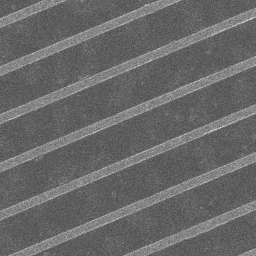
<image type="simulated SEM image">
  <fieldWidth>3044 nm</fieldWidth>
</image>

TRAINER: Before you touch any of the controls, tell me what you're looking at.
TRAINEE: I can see parallel lines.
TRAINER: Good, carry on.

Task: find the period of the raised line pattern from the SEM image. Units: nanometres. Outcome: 528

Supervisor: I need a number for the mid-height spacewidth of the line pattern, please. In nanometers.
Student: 426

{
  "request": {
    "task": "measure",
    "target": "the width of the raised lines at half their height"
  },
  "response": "97.4 nanometres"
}